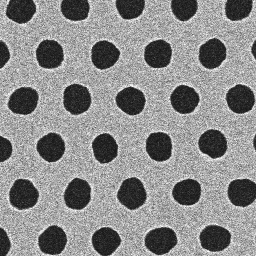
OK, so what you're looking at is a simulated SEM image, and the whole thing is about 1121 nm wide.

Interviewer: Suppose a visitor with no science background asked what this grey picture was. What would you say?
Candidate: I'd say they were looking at a regular array of holes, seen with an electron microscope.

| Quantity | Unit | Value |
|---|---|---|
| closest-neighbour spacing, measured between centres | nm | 232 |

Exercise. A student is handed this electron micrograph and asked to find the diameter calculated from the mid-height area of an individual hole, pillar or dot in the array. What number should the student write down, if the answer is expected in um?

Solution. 0.126